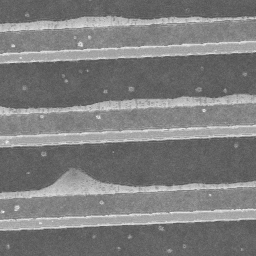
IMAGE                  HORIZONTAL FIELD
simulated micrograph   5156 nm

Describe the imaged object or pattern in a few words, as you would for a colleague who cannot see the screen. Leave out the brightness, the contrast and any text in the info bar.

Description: lines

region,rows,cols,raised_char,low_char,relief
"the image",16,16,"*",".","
................
.....***********
****************
**********......
................
................
..........******
****************
**************..
................
................
................
****************
****************
................
................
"